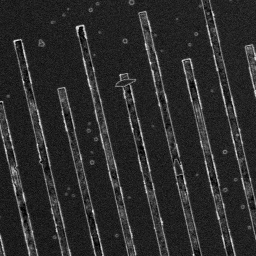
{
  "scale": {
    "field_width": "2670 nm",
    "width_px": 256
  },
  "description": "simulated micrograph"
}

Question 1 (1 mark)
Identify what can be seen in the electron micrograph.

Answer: parallel lines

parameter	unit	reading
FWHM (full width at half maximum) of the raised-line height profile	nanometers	260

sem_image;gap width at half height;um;0.0724